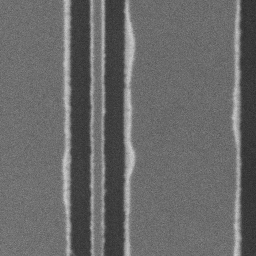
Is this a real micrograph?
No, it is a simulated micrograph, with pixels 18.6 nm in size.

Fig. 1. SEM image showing lines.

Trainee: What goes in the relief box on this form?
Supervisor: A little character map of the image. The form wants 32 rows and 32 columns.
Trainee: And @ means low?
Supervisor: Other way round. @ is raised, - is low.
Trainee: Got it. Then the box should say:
@@@@@@@@---@@---@@@@@@@@@@@@@@--
@@@@@@@@---@@---@@@@@@@@@@@@@@--
@@@@@@@@---@@---@@@@@@@@@@@@@@--
@@@@@@@@---@@---@@@@@@@@@@@@@@--
@@@@@@@@---@@---@@@@@@@@@@@@@@--
@@@@@@@@---@@---@@@@@@@@@@@@@@--
@@@@@@@@---@@---@@@@@@@@@@@@@@--
@@@@@@@@---@@---@@@@@@@@@@@@@@--
@@@@@@@@---@@---@@@@@@@@@@@@@@--
@@@@@@@@---@@---@@@@@@@@@@@@@@--
@@@@@@@@---@@---@@@@@@@@@@@@@@--
@@@@@@@@---@@---@@@@@@@@@@@@@@--
@@@@@@@@---@@---@@@@@@@@@@@@@@--
@@@@@@@@@---@---@@@@@@@@@@@@@@--
@@@@@@@@@--@@---@@@@@@@@@@@@@@--
@@@@@@@@---@@---@@@@@@@@@@@@@@--
@@@@@@@@@--@@---@@@@@@@@@@@@@@--
@@@@@@@@@--@@---@@@@@@@@@@@@@@--
@@@@@@@@@--@@---@@@@@@@@@@@@@@--
@@@@@@@@---@@---@@@@@@@@@@@@@@--
@@@@@@@@---@@---@@@@@@@@@@@@@@--
@@@@@@@@---@@---@@@@@@@@@@@@@@--
@@@@@@@@---@@---@@@@@@@@@@@@@@--
@@@@@@@@---@@---@@@@@@@@@@@@@@--
@@@@@@@@---@@---@@@@@@@@@@@@@@--
@@@@@@@@---@@---@@@@@@@@@@@@@@--
@@@@@@@@@--@@---@@@@@@@@@@@@@@--
@@@@@@@@@--@@---@@@@@@@@@@@@@@--
@@@@@@@@@--@@---@@@@@@@@@@@@@@--
@@@@@@@@@---@---@@@@@@@@@@@@@@--
@@@@@@@@@--@@---@@@@@@@@@@@@@@--
@@@@@@@@@---@---@@@@@@@@@@@@@@--